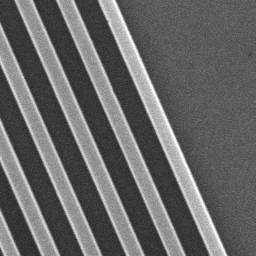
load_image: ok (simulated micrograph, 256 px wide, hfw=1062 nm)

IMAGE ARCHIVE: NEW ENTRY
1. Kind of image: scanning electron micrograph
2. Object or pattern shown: parallel lines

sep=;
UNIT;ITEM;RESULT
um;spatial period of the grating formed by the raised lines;0.159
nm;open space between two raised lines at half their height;98.9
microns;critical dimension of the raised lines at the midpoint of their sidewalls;0.0633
